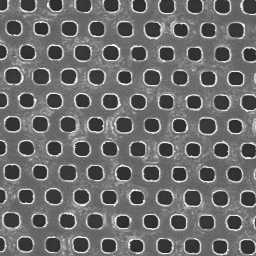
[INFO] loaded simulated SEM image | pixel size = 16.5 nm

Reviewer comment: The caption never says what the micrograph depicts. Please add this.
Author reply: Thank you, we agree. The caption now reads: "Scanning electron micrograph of a regular array of holes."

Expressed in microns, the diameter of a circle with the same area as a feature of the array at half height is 0.246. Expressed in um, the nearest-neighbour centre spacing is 0.452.